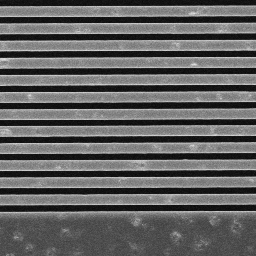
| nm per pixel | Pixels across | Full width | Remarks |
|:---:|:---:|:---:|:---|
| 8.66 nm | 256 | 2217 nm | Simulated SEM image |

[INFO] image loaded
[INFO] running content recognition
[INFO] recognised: parallel lines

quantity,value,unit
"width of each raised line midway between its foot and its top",88.8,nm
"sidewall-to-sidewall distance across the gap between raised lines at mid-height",0.0563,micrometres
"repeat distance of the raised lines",148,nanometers